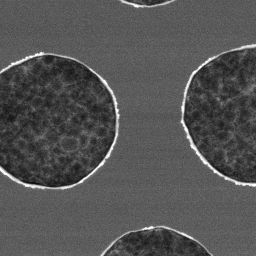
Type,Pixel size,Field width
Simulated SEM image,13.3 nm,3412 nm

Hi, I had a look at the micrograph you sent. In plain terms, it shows holes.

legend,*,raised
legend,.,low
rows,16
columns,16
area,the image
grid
****************
****************
****************
**..**********..
......******....
.......*****....
.......*****....
.......*****....
.......*****....
.......*****....
......*******...
**...***********
****************
****************
********...*****
*******......***